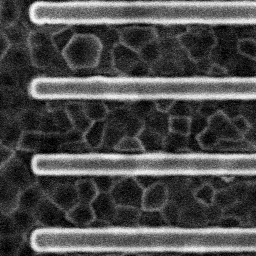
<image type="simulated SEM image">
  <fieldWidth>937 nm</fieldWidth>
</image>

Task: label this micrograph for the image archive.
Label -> one or a few lines or trenches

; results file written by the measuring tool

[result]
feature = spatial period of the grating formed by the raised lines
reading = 75.7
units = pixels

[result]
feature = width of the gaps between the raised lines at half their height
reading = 57.1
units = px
